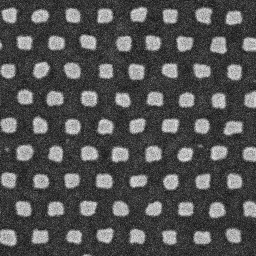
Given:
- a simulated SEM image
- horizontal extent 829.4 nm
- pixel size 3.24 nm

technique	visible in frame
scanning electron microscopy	a regular array of raised bodies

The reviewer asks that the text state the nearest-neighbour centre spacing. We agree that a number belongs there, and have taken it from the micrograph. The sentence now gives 99.3 nm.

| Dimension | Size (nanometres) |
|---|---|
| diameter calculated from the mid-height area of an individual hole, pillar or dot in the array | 48.8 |